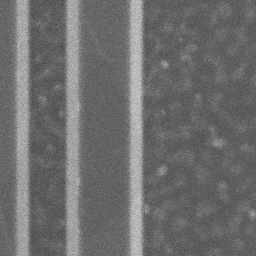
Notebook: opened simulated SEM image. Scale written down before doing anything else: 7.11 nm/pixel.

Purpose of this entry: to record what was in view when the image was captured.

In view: one or a few lines or trenches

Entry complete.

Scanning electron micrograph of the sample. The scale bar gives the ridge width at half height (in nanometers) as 447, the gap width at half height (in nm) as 360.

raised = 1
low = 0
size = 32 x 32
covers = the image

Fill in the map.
11100000011111111000000000000000
11100000011111111000000000000000
11100000011111111000000000000000
11100000011111111000000000000000
11100000011111111000000000000000
11100000011111111000000000000000
11100000011111111000000000000000
11100000011111111000000000000000
11100000011111111000000000000000
11100000011111111000000000000000
11100000011111111000000000000000
11100000011111111000000000000000
11100000011111111000000000000000
11100000011111111000000000000000
11100000011111111000000000000000
11100000011111111000000000000000
11100000011111111000000000000000
11100000011111111000000000000000
11100000011111111000000000000000
11100000011111111000000000000000
11100000011111111000000000000000
11100000011111111000000000000000
11100000011111111000000000000000
11100000011111111000000000000000
11100000011111111000000000000000
11100000011111111000000000000000
11100000011111111000000000000000
11100000011111111000000000000000
11100000011111111000000000000000
11100000011111111000000000000000
11100000011111111000000000000000
11100000011111111000000000000000